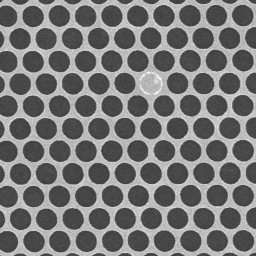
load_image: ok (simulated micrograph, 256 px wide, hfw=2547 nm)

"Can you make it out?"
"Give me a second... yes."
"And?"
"a regular array of holes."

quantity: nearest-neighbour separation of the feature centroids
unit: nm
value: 257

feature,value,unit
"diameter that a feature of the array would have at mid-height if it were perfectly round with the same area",215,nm